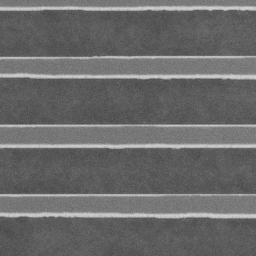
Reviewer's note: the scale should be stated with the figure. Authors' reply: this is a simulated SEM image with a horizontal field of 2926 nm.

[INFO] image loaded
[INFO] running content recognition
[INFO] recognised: lines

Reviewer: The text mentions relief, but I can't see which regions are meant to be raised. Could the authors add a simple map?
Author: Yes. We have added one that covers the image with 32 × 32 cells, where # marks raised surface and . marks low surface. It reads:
################################
................................
................................
................................
................................
................................
................................
################################
################################
...#############################
................................
................................
................................
................................
................................
................................
################################
################################
................................
................................
................................
................................
................................
................................
################################
################################
################################
................................
................................
................................
................................
................................